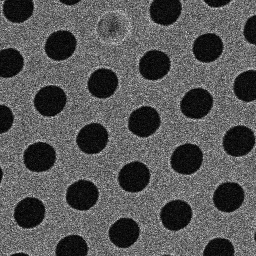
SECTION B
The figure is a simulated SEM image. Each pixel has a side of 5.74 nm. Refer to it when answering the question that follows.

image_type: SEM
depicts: a regular array of holes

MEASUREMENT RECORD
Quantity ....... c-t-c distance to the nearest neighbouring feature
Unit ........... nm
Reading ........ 316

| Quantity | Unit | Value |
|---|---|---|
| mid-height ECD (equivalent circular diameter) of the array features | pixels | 31.4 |